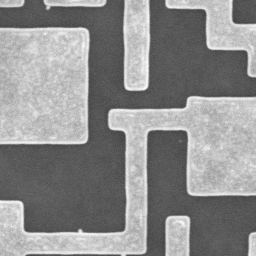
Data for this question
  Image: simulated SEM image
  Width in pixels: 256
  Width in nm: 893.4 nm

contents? wiring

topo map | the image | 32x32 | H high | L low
HHHLLLHHHHHHHLLLHHHLLHHHHHHHHLLL
LLLLLLLLLLLLLLLLHHHLLLLLLLHHHLLL
LLLLLLLLLLLLLLLLHHHLLLLLLLHHHLLL
LLLLLLLLLLLLLLLLHHHLLLLLLLHHHHHH
HHHHHHHHHHHLLLLLHHHLLLLLLLHHHHHH
HHHHHHHHHHHLLLLLHHHLLLLLLLHHHHHH
HHHHHHHHHHHLLLLLHHHLLLLLLLLLLLLH
HHHHHHHHHHHLLLLLHHLLLLLLLLLLLLLH
HHHHHHHHHHHLLLLLHHLLLLLLLLLLLLLH
HHHHHHHHHHHLLLLLHHLLLLLLLLLLLLLH
HHHHHHHHHHHLLLLLHHLLLLLLLLLLLLLL
HHHHHHHHHHHLLLLLLLLLLLLLLLLLLLLL
HHHHHHHHHHHLLLLLLLLLLLLLHHHHHHHH
HHHHHHHHHHHLLLLLLLLLLLLHHHHHHHHH
HHHHHHHHHHHLLLHHHHHHHHHHHHHHHHHH
HHHHHHHHHHHLLLHHHHHHHHHHHHHHHHHH
HHHHHHHHHHHLLLLHHHHLLLLHHHHHHHHH
HHHHHHHHHHHLLLLLHHLLLLLLHHHHHHHH
LLLLLLLLLLLLLLLLHHLLLLLLHHHHHHHH
LLLLLLLLLLLLLLLLHHLLLLLLHHHHHHHH
LLLLLLLLLLLLLLLLHHLLLLLHHHHHHHHH
LLLLLLLLLLLLLLLLHHLLLLLHHHHHHHHH
LLLLLLLLLLLLLLLLHHLLLLLHHHHHHHHH
LLLLLLLLLLLLLLLLHHLLLLLHHHHHHHHH
LLLLLLLLLLLLLLLLHHLLLLLLLLLLLLLL
HHHLLLLLLLLLLLLLHHLLLLLLLLLLLLLL
HHHLLLLLLLLLLLLLHHLLLLLLLLLLLLLL
HHHLLLLLLLLLLLLLHHLLLHHHLLLLLLLL
HHHLLLLLLLLLLLLLHHLLLHHHLLLLLLLL
HHHHHHHHHHHHHHHHHHLLLHHHLLLLLLLH
HHHHHHHHHHHHHHHHHHLLLHHLLLLLLLLH
HHHHHHHHHHHHHHHHHHLLLHHLLLLLLLLH